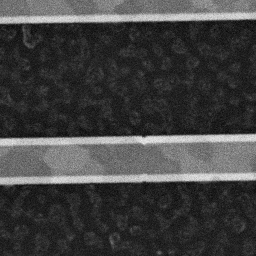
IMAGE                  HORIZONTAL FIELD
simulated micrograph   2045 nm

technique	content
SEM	one or a few lines or trenches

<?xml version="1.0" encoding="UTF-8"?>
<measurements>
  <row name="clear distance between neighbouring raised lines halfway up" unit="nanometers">978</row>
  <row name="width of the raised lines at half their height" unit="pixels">37.5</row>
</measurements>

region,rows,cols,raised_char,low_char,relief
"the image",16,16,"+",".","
++++++++++++++++
................
................
................
................
................
................
................
................
++++++++++++++++
++++++++++++++++
................
................
................
................
................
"